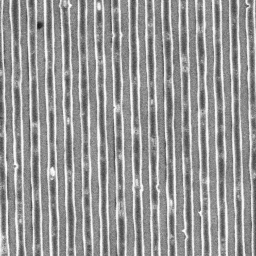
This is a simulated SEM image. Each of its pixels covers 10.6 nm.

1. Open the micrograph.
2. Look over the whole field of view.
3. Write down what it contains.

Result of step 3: parallel lines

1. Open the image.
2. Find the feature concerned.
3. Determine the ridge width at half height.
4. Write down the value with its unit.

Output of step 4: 0.0898 microns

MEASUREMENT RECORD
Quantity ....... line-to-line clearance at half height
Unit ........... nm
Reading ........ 89.8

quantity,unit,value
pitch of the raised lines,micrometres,0.178